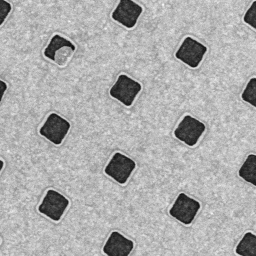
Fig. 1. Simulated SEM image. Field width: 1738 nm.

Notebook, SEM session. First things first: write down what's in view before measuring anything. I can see a regular array of holes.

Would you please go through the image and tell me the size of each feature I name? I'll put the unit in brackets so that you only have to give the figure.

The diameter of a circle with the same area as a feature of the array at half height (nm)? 196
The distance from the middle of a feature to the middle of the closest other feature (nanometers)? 517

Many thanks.